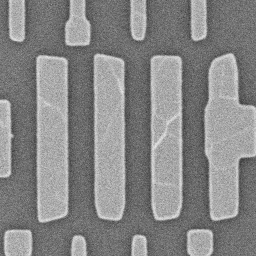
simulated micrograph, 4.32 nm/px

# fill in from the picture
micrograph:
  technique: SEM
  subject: wiring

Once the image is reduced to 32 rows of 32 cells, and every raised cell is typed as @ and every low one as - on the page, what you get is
-@@------@@-----@@------@@------
-@@------@@-----@@------@@------
-@@------@@-----@@------@@------
-@@-----@@@-----@@------@@------
-@@-----@@@------@------@@------
---------@@---------------------
--------------------------------
-----@@@----@@@----@@@@----@@---
-----@@@----@@@----@@@@---@@@@--
-----@@@----@@@----@@@@---@@@@--
-----@@@----@@@----@@@@---@@@@--
-----@@@----@@@----@@@@---@@@@--
-----@@@----@@@----@@@@---@@@@--
@----@@@----@@@----@@@@---@@@@@@
@----@@@----@@@----@@@@---@@@@@@
@----@@@----@@@----@@@@---@@@@@@
@----@@@----@@@----@@@@---@@@@@@
@----@@@----@@@----@@@@---@@@@@@
@----@@@----@@@----@@@@---@@@@@@
@----@@@----@@@----@@@@---@@@@@@
@----@@@----@@@----@@@@---@@@@--
@----@@@----@@@@---@@@@---@@@@--
-----@@@----@@@@---@@@@---@@@@--
-----@@@----@@@----@@@@---@@@@--
-----@@@----@@@@---@@@@---@@@@--
-----@@@----@@@@---@@@@---@@@@--
-----@@@----@@@----@@@----@@@@--
-----@@-------@-----------------
--------------------------------
-@@@-------------@------@@@-----
-@@@-----@@------@------@@@-----
-@@@-----@@------@------@@------